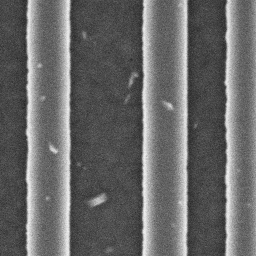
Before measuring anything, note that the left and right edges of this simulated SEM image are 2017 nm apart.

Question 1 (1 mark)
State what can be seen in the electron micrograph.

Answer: lines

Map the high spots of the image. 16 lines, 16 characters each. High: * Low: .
..**.....***..**
..**.....***..**
..**.....***..**
..**.....***..**
..**.....***..**
..**.....***..**
..**.....***..**
..**.....***..**
..**.....***..**
..**.....***..**
..**.....***..**
..**.....***..**
..**.....***..**
..**.....***..**
..**.....***..**
..**.....***..**